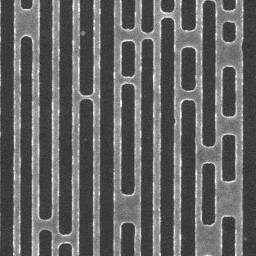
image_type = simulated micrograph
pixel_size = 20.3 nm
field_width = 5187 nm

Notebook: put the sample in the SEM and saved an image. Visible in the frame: parallel lines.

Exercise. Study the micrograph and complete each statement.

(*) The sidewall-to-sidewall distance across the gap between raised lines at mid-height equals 0.281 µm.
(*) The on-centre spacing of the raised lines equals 0.408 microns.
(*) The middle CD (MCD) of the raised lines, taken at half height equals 0.132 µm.